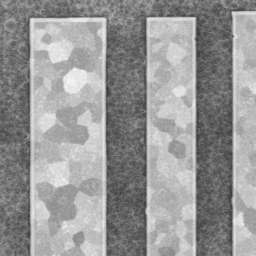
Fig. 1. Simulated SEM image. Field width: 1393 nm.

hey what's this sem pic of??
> one or a few lines or trenches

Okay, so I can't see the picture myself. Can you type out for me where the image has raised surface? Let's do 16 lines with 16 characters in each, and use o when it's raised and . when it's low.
................
..oooo...ooo...o
..ooooo..ooo...o
..ooooo..ooo...o
..ooooo..ooo...o
..ooooo..ooo...o
..ooooo..ooo...o
..oooo...ooo...o
..ooooo..ooo...o
..ooooo..ooo...o
..ooooo..ooo...o
..ooooo..ooo...o
..ooooo..ooo...o
..ooooo..ooo...o
..ooooo..ooo...o
..ooooo..ooo...o